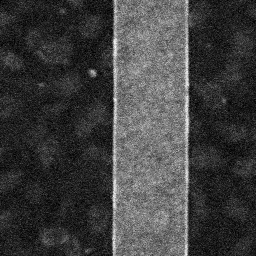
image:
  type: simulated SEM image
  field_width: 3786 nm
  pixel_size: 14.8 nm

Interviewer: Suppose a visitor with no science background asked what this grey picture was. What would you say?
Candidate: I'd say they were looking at one or a few lines or trenches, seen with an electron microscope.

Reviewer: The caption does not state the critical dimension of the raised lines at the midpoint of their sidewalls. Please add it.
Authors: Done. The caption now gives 1090 nm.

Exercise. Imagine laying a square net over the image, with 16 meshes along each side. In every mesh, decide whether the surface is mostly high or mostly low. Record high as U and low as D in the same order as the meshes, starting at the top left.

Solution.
DDDDDDDUUUUUDDDD
DDDDDDDUUUUUDDDD
DDDDDDDUUUUUDDDD
DDDDDDDUUUUUDDDD
DDDDDDDUUUUUDDDD
DDDDDDDUUUUUDDDD
DDDDDDDUUUUUDDDD
DDDDDDDUUUUUDDDD
DDDDDDDUUUUUDDDD
DDDDDDDUUUUUDDDD
DDDDDDDUUUUUDDDD
DDDDDDDUUUUUDDDD
DDDDDDDUUUUUDDDD
DDDDDDDUUUUUDDDD
DDDUDDDUUUUUDDDD
DDDDDDDUUUUUDDDD